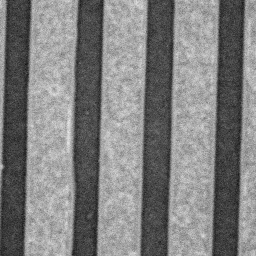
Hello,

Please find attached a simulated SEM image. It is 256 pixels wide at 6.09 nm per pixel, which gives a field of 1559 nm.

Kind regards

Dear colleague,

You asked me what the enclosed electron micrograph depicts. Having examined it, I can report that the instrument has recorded one or a few lines or trenches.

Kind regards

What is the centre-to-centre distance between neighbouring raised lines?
71.4 pixels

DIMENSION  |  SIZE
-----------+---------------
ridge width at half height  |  270 nm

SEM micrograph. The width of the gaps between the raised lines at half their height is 162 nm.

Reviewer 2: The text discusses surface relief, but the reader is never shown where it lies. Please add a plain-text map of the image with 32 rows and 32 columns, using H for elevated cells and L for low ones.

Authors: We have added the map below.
HLLLHHHHHHLLLHHHHHLLLLHHHHHLLLLH
HLLLHHHHHHLLLHHHHHLLLLHHHHHLLLLH
HLLLHHHHHHLLLHHHHHLLLLHHHHHLLLLH
HLLLHHHHHLLLLHHHHHLLLLHHHHHLLLLH
HLLLHHHHHLLLLHHHHHLLLLHHHHHLLLLH
HLLLHHHHHLLLLHHHHHLLLLHHHHHLLLLH
HLLLHHHHHLLLLHHHHHLLLLHHHHHLLLLH
HLLLHHHHHLLLLHHHHHLLLLHHHHHLLLLH
LLLLHHHHHLLLLHHHHHLLLLHHHHHLLLHH
LLLLHHHHHLLLLHHHHHLLLLHHHHHLLLHH
LLLLHHHHHLLLLHHHHHLLLLHHHHHLLLHH
LLLLHHHHHLLLLHHHHHLLLLHHHHHLLLHH
LLLLHHHHHLLLLHHHHHLLLLHHHHHLLLHH
LLLLHHHHHLLLLHHHHHLLLLHHHHHLLLHH
LLLHHHHHHLLLLHHHHHLLLLHHHHHLLLHH
LLLHHHHHHLLLLHHHHHLLLLHHHHHLLLHH
LLLHHHHHHLLLLHHHHHLLLLHHHHHLLLHH
LLLHHHHHHLLLLHHHHHLLLLHHHHHLLLHH
LLLHHHHHHLLLHHHHHHLLLHHHHHHLLLHH
LLLHHHHHHLLLHHHHHHLLLHHHHHHLLLHH
LLLHHHHHHLLLHHHHHHLLLHHHHHHLLLHH
LLLHHHHHHLLLHHHHHHLLLHHHHHHLLLHH
LLLHHHHHHLLLHHHHHHLLLHHHHHHLLLHH
LLLHHHHHHLLLHHHHHHLLLHHHHHHLLLHH
LLLHHHHHHLLLHHHHHHLLLHHHHHHLLLHH
LLLHHHHHHLLLHHHHHHLLLHHHHHHLLLHH
LLLHHHHHHLLLHHHHHHLLLHHHHHHLLLHH
LLLHHHHHHLLLHHHHHHLLLHHHHHHLLLHH
LLLHHHHHHLLLHHHHHHLLLHHHHHHLLLHH
LLLHHHHHHLLLHHHHHHLLLHHHHHLLLLHH
LLLHHHHHHLLLHHHHHLLLLHHHHHLLLLHH
LLLHHHHHHLLLHHHHHLLLLHHHHHLLLLHH